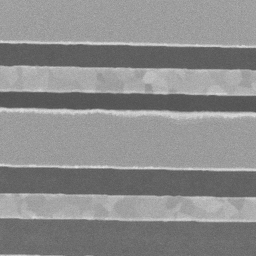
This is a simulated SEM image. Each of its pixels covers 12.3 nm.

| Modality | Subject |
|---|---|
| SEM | lines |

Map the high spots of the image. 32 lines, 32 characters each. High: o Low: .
oooooooooooooooooooooooooooooooo
oooooooooooooooooooooooooooooooo
oooooooooooooooooooooooooooooooo
oooooooooooooooooooooooooooooooo
oooooooooooooooooooooooooooooooo
........o.oooooooooooooooooooooo
................................
................................
oooooooooo......................
oooooooooooooooooooooooooooooooo
oooooooooooooooooooooooooooooooo
......oo..oooooooooooooooooooooo
................................
o...............................
oooooooooooooooooooooooooooooooo
oooooooooooooooooooooooooooooooo
oooooooooooooooooooooooooooooooo
oooooooooooooooooooooooooooooooo
oooooooooooooooooooooooooooooooo
oooooooooooooooooooooooooooooooo
oooooooooooooooooooooooooooooooo
................................
................................
................................
oooooooooooooo..................
oooooooooooooooooooooooooooooooo
oooooooooooooooooooooooooooooooo
...............ooooooooooooooooo
................................
................................
................................
................................